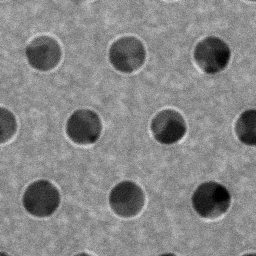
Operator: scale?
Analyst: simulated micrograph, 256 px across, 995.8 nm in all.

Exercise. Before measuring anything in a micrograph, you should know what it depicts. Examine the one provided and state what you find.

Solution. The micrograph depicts a regular array of raised bodies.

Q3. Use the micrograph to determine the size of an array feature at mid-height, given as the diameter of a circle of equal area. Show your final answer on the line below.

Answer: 159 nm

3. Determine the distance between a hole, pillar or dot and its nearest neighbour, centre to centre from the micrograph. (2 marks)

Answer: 325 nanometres